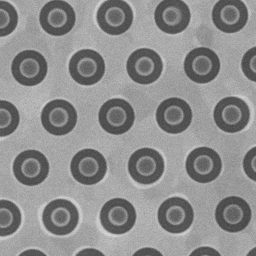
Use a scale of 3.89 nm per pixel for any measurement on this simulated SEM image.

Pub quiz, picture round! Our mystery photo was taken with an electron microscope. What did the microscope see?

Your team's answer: an array of small figures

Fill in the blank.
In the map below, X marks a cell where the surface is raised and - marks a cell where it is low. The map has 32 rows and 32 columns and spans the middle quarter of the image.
X---XXXX--XXXXX---XXXX---XXXXX--
X---XXXX--XXXXX----XXX---XXXXX--
X---XXX---XXXXXX---X----XXXXXX--
XX-------XXXXXXXX-------XXXXXXX-
XXX------XXXXXXXXX-----XXXXXXXXX
XXXXX--XXXXXXXXXXXXXXXXXXXXXXXXX
XXXXXXXXXXXXXXXXXXXXXXXXXXXXXXXX
XXXXXXXXXXXXXXXXXXXXXXXXXXXXXXXX
XXXXXXXXXXXX---XXXXXXXXXXX---XXX
-XXXXXXXXX------XXXXXXXX------XX
--XXXXXXX--------XXXXXXX--------
---XXXXXX---XXX--XXXXXX---XXX---
---XXXXX---XXXX---XXXXX--XXXXX--
----XXXX---XXXX---XXXXX--XXXX---
---XXXXXX--XXXX--XXXXXX---XXX---
---XXXXXX--------XXXXXXX-------X
--XXXXXXXX------XXXXXXXX------XX
-XXXXXXXXXXX--XXXXXXXXXXXXX-XXXX
XXXXXXXXXXXXXXXXXXXXXXXXXXXXXXXX
XXXXXXXXXXXXXXXXXXXXXXXXXXXXXXXX
XXXXXXXXXXXXXXXXXXXXXXXXXXXXXXXX
XXXX----XXXXXXXXXX-----XXXXXXXXX
XXX------XXXXXXXX--------XXXXXX-
XX--------XXXXXX----XX---XXXXX--
XX--XXXX---XXXXX---XXXX--XXXXX--
X---XXXX---XXXXX--XXXXX--XXXXX--
XX--XXXX---XXXXX--XXXXX--XXXXX--
XX---XXX---XXXXX---XXX---XXXXXX-
XX--------XXXXXXX-------XXXXXXXX
XXX------XXXXXXXX------XXXXXXXXX
XXXXXXXXXXXXXXXXXXX--XXXXXXXXXXX
XXXXXXXXXXXXXXXXXXXXXXXXXXXXXXXX